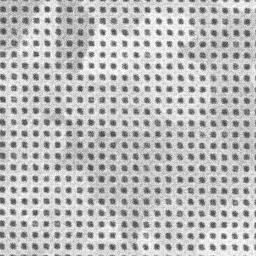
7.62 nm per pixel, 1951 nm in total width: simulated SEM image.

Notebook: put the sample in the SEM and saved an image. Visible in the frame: a regular array of holes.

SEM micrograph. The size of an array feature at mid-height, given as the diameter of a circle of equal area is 0.059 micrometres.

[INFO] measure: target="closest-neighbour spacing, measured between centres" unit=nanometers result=83.4